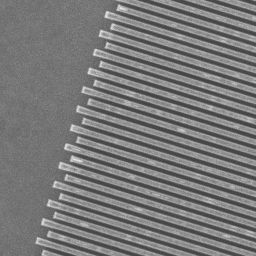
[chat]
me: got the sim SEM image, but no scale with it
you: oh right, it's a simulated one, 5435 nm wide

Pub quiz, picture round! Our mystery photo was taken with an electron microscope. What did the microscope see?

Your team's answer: parallel lines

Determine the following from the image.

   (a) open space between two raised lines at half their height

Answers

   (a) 0.0914 µm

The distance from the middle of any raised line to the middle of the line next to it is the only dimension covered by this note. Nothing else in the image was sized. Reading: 209 nm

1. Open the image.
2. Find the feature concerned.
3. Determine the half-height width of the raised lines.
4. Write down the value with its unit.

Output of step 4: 127 nanometres